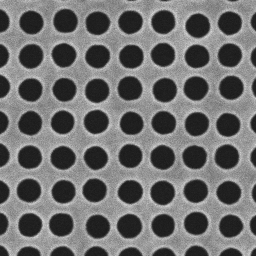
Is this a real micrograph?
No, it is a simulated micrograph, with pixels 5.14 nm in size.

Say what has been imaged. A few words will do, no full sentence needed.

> a regular array of holes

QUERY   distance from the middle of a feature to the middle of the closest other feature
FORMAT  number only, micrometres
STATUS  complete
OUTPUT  0.166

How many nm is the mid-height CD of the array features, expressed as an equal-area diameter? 123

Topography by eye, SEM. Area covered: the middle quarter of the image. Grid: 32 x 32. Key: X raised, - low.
-XXXXXX---XXXXX----XXXX---XXXXX-
XXXXXXXXXXXXXXXXXXXXXXXXXXXXXXXX
XXXXXXXXXXXXXXXXXXXXXXXXXXXXXXXX
XXXXXXXXXXXXXXX---XXXXXXX-XXXXXX
--XXXX----XXXX-----XXXX-----XX--
---XXX-----XX-------XX------XX--
---XX------XX-------XX------XX--
---XX------XXX-----XXX------XX--
--XXXX-----XXXX---XXXXX----XXXX-
XXXXXXX---XXXXXXXXXXXXXX--XXXXXX
XXXXXXXXXXXXXXXXXXXXXXXXXXXXXXXX
XXXXXXXX-XXXXXXXXXXXXXXXXXXXXXXX
--XXXX----XXXXX---XXXXX----XXXXX
---XX------XXX------XX------XXX-
---XX------XXX------XX------XX--
--XXX------XXX------XX------XX--
--XXXX----XXXX-----XXXX-----XXX-
XXXXXXXXXXXXXXX---XXXXXX--XXXXX-
XXXXXXXXXXXXXXXXXXXXXXXXXXXXXXXX
XXXXXXXXXXXXXXXXXXXXXXXXXXXXXXXX
XXXXXXXXXXXXXXX---XXXXX---XXXXXX
--XXXX----XXXX-----XXX-----XXX--
---XX------XXX-----XXX------XX--
---XX------XXX-----XXX------XX--
---XX------XXX-----XXX-----XXX--
--XXXX----XXXXX---XXXX-----XXXX-
XXXXXXX-XXXXXXXXXXXXXXXXXXXXXXXX
XXXXXXXXXXXXXXXXXXXXXXXXXXXXXXXX
XXXXXXXXXXXXXXXXXXXXXXXXXXXXXXXX
--XXXX----XXXXX---XXXXXX--XXXXX-
---XX------XXX-----XXX-----XXX--
---X-------XXX------XX------XX--